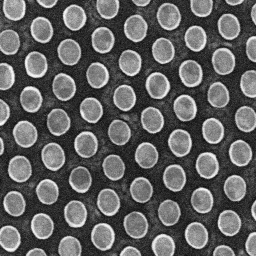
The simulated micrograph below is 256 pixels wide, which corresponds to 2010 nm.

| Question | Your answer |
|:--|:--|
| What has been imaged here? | a regular array of raised bodies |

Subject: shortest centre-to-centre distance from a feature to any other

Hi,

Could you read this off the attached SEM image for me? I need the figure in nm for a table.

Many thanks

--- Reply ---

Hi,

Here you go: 274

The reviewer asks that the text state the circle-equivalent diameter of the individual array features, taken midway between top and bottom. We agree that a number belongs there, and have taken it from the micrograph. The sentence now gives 184 nanometres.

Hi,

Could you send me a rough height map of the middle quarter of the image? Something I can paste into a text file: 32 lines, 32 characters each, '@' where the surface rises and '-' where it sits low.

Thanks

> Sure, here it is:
-------@@@----@@@@@----------@@@
------@@@@@---@@@@@----------@@@
------@@@@@-----@@----@@-----@@@
@@----@@@@@----------@@@@@---@@@
@@----@@@@@----------@@@@@----@@
@@@----@@@----@@-----@@@@@-----@
@@@----------@@@@----@@@@@------
@@-----------@@@@@---@@@@-------
@@----------@@@@@@-----@-----@@@
-----@@@@----@@@@@----------@@@@
----@@@@@----@@@@-----------@@@@
----@@@@@@----------@@@----@@@@@
----@@@@@----------@@@@@----@@@@
@----@@@@----------@@@@@@----@@@
@-----@@----@@@-----@@@@@-------
@----------@@@@@----@@@@--------
@----------@@@@@-----@@@----@---
----@@@----@@@@@@----------@@@@-
---@@@@@---@@@@@----------@@@@@@
---@@@@@----@@@@----------@@@@@@
---@@@@@-----------@@@----@@@@@@
---@@@@@----------@@@@@----@@@@-
----@@@@----------@@@@@-----@@@-
-----------@@@----@@@@@---------
----------@@@@@---@@@@@---------
----------@@@@@----@@@----@@@---
--@@@@----@@@@@----------@@@@@--
--@@@@----@@@@@----------@@@@@--
-@@@@@@----@@@----@@-----@@@@@--
-@@@@@@----------@@@@----@@@@@--
--@@@@-----------@@@@@----@@@@--
---@@@----@------@@@@@-----@@---